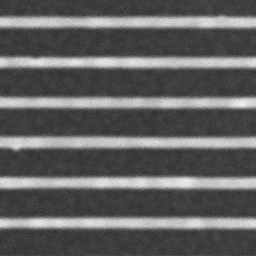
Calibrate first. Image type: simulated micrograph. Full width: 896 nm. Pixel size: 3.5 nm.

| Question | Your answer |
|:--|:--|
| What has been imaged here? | parallel lines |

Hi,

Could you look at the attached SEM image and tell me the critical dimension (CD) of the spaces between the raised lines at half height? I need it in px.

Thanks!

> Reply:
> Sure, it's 31.9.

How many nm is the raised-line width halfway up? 30.2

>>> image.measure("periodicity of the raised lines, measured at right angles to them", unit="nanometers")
141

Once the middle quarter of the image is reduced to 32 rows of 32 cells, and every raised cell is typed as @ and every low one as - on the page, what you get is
@@@@@@@@@@@@@@@@@@@@@@@@@@@@@@@@
--------------------------------
--------------------------------
--------------------------------
--------------------------------
--------------------------------
--------------------------------
--------------------------------
--------------------------------
@@@@@@@@@@@@@@@@@@@@@@@@@@@@@@@@
@@@@@@@@@@@@@@@@@@@@@@@@@@@@@@@@
--------------------------------
--------------------------------
--------------------------------
--------------------------------
--------------------------------
--------------------------------
--------------------------------
--------------------------------
@@@@@@@@@@@@@@@@@@@@@@@@@@@@@@@@
@@@@@@@@@@@@@@@@@@@@@@@@@@@@@@@@
--------------------------------
--------------------------------
--------------------------------
--------------------------------
--------------------------------
--------------------------------
--------------------------------
--------------------------------
@@@@@@@@@@@@@@@@@@@@@@@@@@@@@@@@
@@@@@@@@@@---@@@@@@@@@@@@@@@@@@@
--------------------------------